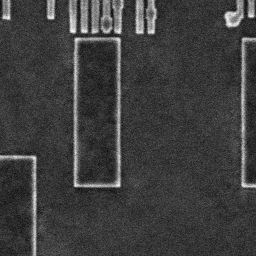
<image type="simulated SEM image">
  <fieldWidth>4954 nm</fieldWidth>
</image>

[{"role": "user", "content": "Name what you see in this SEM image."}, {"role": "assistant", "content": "wiring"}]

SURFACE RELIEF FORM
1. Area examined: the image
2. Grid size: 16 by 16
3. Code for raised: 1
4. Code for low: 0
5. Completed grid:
0000011100000001
0000011000000010
0000011000000001
0000011000000001
0000011000000001
0000011000000001
0000011000000001
0000011000000001
0000011000000001
0000011000000001
1100011000000001
1100011000000001
1100000000000000
1100000000000000
1100000000000000
1100000000000000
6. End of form